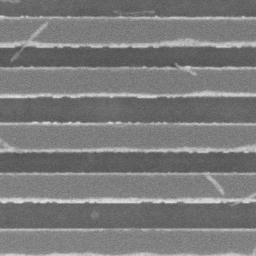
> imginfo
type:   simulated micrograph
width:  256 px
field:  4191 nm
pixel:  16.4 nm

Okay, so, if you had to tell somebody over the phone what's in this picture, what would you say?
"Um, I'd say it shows lines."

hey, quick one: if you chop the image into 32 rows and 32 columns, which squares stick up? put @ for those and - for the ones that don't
--------------------------------
--------------------------------
@@@@@@@@@@@@@@@@@@@@@@@@@@@@@@@@
@@@@@@@@@@@@@@@@@@@@@@@@@@@@@@@@
@@@@@@@@@@@@@@@@@@@@@@@@@@@@@@@@
@@@@@@@@@@@@@@@@@@@@@@@@@@@@@@@@
--------------------------------
--------------------------------
@@@@@@@@@@@-@@@@@@-@@@@@@@@@@@@@
@@@@@@@@@@@@@@@@@@@@@@@@@@@@@@@@
@@@@@@@@@@@@@@@@@@@@@@@@@@@@@@@@
@@@@@@@@@@@@@@@@@@@@@@@@@@@@@@@@
--------------------------------
--------------------------------
--------------------------------
@@@@@@@@@@@@@@@@-@@@@@-@@@@@----
@@@@@@@@@@@@@@@@@@@@@@@@@@@@@@@@
@@@@@@@@@@@@@@@@@@@@@@@@@@@@@@@@
@@@@@@@@@@@@@@@@@@@@@@@@@@@@@@@@
--------------------------------
--------------------------------
--------------------------------
@@@@@@@@@@@@@@@@@@@@@@@@@@@@@@@@
@@@@@@@@@@@@@@@@@@@@@@@@@@@@@@@@
@@@@@@@@@@@@@@@@@@@@@@@@@@@@@@@@
--------------------------------
--------------------------------
--------------------------------
--------------------------------
@@@@@@@@@@@@@@@@@@@@@@@@@@@@@@@@
@@@@@@@@@@@@@@@@@@@@@@@@@@@@@@@@
@@@@@@@@@@@@@@@@@@@@@@@@@@@@@@@@